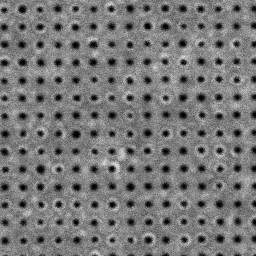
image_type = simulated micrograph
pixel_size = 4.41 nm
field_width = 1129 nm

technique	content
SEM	a regular array of holes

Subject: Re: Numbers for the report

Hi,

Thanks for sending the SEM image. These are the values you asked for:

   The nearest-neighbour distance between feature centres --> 76.6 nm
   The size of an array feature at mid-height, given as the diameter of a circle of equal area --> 7.05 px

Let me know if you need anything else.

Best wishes